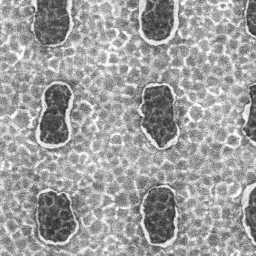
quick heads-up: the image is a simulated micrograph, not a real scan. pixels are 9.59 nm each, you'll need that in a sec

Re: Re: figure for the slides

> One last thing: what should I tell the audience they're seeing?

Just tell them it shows raised bodies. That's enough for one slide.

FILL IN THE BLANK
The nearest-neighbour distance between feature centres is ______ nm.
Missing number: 972